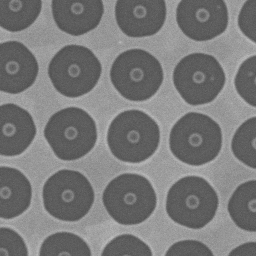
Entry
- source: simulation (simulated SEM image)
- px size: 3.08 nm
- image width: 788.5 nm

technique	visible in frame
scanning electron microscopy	an array of small figures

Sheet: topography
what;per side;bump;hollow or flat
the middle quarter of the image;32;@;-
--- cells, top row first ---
--@------@@@------------@@@@----
-@@@-----@@------@@------@@-----
-@@@-----@@------@@@-----@@-----
---------@@@-----@@------@@-----
---------@@@-------------@@-----
--------@@@@------------@@@-----
-------@@@@@@-----------@@@@----
------@@@@@@@@---------@@@@@@---
@--@@@@@@@@@@@@-------@@@@@@@---
@@@@@@@@@@@@@@@@@---@@@@@@@@@@--
@@@@@@@@@@@@@@@@@@@@@@@@@@@@@@@@
-----@@@@@@@@@@-----@@@@@@@@@@@@
-------@@@@@@--------@@@@@@@@@--
-------@@@@@----------@@@@@@@---
--------@@@@-----------@@@@@----
--------@@@-------------@@@-----
-@@-----@@@-------------@@------
@@@------@@-----@@@-----@@------
-@@------@------@@@-----@@-----@
--------@@-------@------@@-----@
--------@@@-------------@@------
-------@@@@-------------@@------
------@@@@@@-----------@@@@-----
----@@@@@@@@@---------@@@@@@----
@@@@@@@@@@@@@@@-----@@@@@@@@@---
@@@@@@@@@@@@@@@@@@@@@@@@@@@@@@@@
---@@@@@@@@@@@@@@@@@@@@@@@@@@@@@
-----@@@@@@@@@-----@@@@@@@@@@@@@
------@@@@@@---------@@@@@@@@---
-------@@@@-----------@@@@@@----
-------@@@------------@@@@@-----
-------@@@-------------@@@------